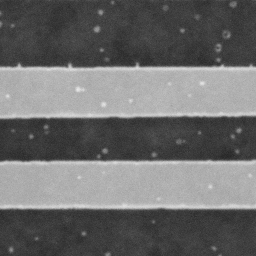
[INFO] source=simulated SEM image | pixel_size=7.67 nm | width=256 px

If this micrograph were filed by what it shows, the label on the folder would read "lines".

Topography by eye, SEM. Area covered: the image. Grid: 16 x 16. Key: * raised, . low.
................
................
................
................
****************
****************
****************
................
................
................
****************
****************
****************
................
................
................